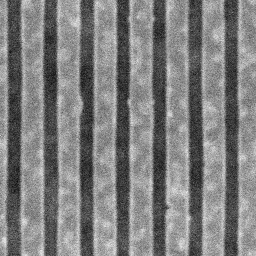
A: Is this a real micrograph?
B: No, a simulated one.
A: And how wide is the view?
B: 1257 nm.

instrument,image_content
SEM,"parallel lines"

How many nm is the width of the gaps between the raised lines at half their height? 71.8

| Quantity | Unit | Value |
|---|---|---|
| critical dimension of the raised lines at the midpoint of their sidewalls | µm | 0.107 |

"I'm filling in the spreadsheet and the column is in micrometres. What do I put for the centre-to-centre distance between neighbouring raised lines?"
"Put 0.177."